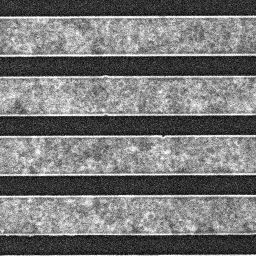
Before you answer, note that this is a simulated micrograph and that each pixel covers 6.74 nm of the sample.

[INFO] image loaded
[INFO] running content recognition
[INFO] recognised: parallel lines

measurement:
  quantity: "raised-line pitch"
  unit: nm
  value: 402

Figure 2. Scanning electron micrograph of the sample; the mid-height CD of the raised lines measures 255 nm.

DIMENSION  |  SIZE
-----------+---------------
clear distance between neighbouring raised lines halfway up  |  0.144 µm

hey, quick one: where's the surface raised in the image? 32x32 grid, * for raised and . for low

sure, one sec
................................
................................
********************************
********************************
********************************
********************************
********************************
................................
................................
................................
********************************
********************************
********************************
********************************
................................
................................
................................
********************************
********************************
********************************
********************************
********************************
................................
................................
................................
********************************
********************************
********************************
********************************
................................
................................
................................